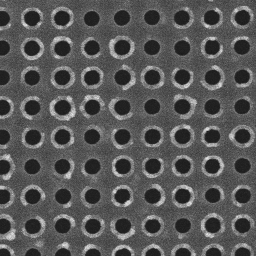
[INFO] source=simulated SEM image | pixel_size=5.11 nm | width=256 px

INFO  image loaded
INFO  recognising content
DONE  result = a regular array of holes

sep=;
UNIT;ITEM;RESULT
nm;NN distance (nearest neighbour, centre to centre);150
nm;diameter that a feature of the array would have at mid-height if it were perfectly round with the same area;79.7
